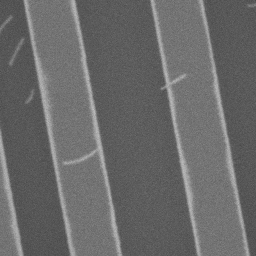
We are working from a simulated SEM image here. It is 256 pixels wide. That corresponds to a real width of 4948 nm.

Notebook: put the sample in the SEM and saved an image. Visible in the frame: lines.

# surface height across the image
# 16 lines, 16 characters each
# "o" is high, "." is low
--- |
..ooo....oooo...
..ooo.....ooo...
..ooo.....ooo...
..ooo.....ooo...
..oooo....oooo..
...ooo....oooo..
...ooo.....ooo..
...ooo.....ooo..
...ooo.....ooo..
...ooo.....ooo..
...oooo....oooo.
o...ooo.....ooo.
o...ooo.....ooo.
o...ooo.....ooo.
o...ooo.....ooo.
o...oooo....oooo